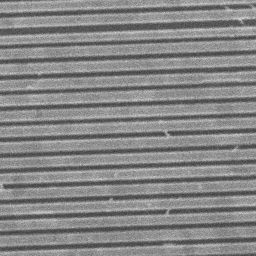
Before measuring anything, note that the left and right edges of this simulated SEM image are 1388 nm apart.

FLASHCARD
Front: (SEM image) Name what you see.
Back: parallel lines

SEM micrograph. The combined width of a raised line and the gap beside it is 84.4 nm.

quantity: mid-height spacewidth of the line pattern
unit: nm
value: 36.5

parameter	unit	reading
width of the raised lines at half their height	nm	45.3